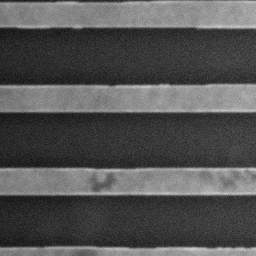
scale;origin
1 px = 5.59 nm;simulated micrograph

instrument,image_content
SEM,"lines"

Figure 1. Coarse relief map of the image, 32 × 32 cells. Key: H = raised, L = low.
HHHHHHHHHHHHHHHHHHHHHHHHHHHHHHHH
HHHHHHHHHHHHHHHHHHHHHHHHHHHHHHHH
HHHHHHHHHHHHHHHHHHHHHHHHHHHHHHHH
LLLLLLLLLLLLLLLLLLLLLLLLLLLLLLLL
LLLLLLLLLLLLLLLLLLLLLLLLLLLLLLLL
LLLLLLLLLLLLLLLLLLLLLLLLLLLLLLLL
LLLLLLLLLLLLLLLLLLLLLLLLLLLLLLLL
LLLLLLLLLLLLLLLLLLLLLLLLLLLLLLLL
LLLLLLLLLLLLLLLLLLLLLLLLLLLLLLLL
LLLLLLLLLLLLLLLLLLLLLLLLLLLLLLLL
LLLLLLLLLLLLLLLLLLLLLLLLLLLLLLLL
HHHHHHHHHHHHHHHHHHHHHHHHHHHHHHHH
HHHHHHHHHHHHHHHHHHHHHHHHHHHHHHHH
HHHHHHHHHHHHHHHHHHHHHHHHHHHHHHHH
LLLLLLLLLLLLLLLLLLLLLLLLLLLLLLLL
LLLLLLLLLLLLLLLLLLLLLLLLLLLLLLLL
LLLLLLLLLLLLLLLLLLLLLLLLLLLLLLLL
LLLLLLLLLLLLLLLLLLLLLLLLLLLLLLLL
LLLLLLLLLLLLLLLLLLLLLLLLLLLLLLLL
LLLLLLLLLLLLLLLLLLLLLLLLLLLLLLLL
LLLLLLLLLLLLLLLLLLLLLLLLLLLLLLLL
HHHHHHHHHHHHHHHHHHHHHHHHHHHHHHHH
HHHHHHHHHHHHHHHHHHHHHHHHHHHHHHHH
HHHHHHHHHHHHHHHHHHHHHHHHHHHHHHHH
LLLLLLLLLLLLLLLLLLLLLLLLLLLLLLLL
LLLLLLLLLLLLLLLLLLLLLLLLLLLLLLLL
LLLLLLLLLLLLLLLLLLLLLLLLLLLLLLLL
LLLLLLLLLLLLLLLLLLLLLLLLLLLLLLLL
LLLLLLLLLLLLLLLLLLLLLLLLLLLLLLLL
LLLLLLLLLLLLLLLLLLLLLLLLLLLLLLLL
LLLLLLLLLLLLLLLLLLLLLLLLLLLLLLLL
HHHHHHHHHHHHHHHHHHHHHHHHHHHHHHHH